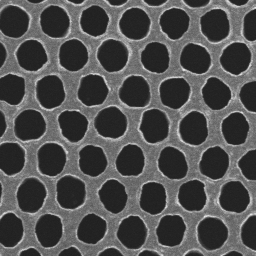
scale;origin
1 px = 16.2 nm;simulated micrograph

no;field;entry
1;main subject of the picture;a regular array of holes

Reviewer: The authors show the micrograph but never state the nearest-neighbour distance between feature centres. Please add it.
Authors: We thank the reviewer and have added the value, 634 nm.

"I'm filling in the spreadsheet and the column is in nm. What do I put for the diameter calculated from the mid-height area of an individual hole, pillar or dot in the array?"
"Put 501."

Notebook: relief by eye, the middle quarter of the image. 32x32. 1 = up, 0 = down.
00000111100000011111000000111100
10001111110000111111100001111110
11111111111111111111111111111111
11111000001111110000111111110011
11110000001111100000011110000001
11110000000111100000011100000001
11110000000111000000001100000001
11100000000111000000001100000001
11110000001111000000001100000001
11110000001111000000011100000001
11111101111111110000111111000011
11011111100000111111100011111111
00001111000000011111000001111110
00000011000000011110000001111100
00000011000000001110000000111000
00000011000000001110000000111000
00000011000000011110000000111000
00000111100000011111000000111000
10000111111101111111000000111100
11011111111111111111100011111100
11111000111111100001111111111111
11110000001111000001111100000111
11110000001111000000111100000011
01110000001110000000111100000011
11110000000110000000111000000001
11110000000110000000111100000001
11110000001110000000111100000001
11111000011111000001111110000001
00011111111111111111111111000011
00000111110000111111100111111110
00000111100000011111000001111000
00000111100000011110000001111000